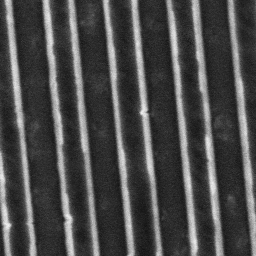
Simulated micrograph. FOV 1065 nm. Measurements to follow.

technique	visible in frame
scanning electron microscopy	one or a few lines or trenches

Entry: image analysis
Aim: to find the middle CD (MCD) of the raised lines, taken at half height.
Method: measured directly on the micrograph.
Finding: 0.114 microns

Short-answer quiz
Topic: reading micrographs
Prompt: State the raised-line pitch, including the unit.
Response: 257 nm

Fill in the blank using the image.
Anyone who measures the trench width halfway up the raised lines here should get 141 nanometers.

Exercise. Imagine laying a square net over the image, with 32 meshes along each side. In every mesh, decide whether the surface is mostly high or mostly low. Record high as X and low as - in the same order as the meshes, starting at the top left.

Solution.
X-----XXX----XXXX----XXX-----XXX
X-----XXX----XXXX----XXXX----XXX
X-----XXX----XXXX----XXXX----XXX
XX----XXX----XXXX----XXXX----XXX
XX----XXX-----XXX-----XXX----XXX
XX----XXXX----XXX-----XXX----XXX
XX----XXXX----XXX-----XXX----XXX
XX----XXXX----XXXX----XXX----XXX
XX----XXXX----XXXX----XXX-----XX
XX----XXXX----XXXX----XXX-----XX
XX-----XXX----XXXX----XXX-----XX
XX-----XXX----XXXX----XXXX----XX
XX-----XXX----XXXX----XXXX----XX
XX-----XXX----XXXX----XXXX----XX
XXX----XXX-----XXX----XXXX----XX
XXX----XXX-----XXX-----XXX----XX
XXX----XXXX----XXXX----XXX----XX
XXX----XXXX----XXXX----XXX----XX
XXX----XXXX----XXXX----XXX-----X
XXX-----XXX----XXXX----XXX-----X
XXX-----XXX----XXXX----XXX-----X
XXX-----XXX----XXXX----XXXX----X
XXX-----XXX----XXXX----XXXX----X
XXX-----XXX----XXXX----XXXX----X
XXX-----XXX-----XXX----XXXX----X
XXXX----XXX-----XXX-----XXX----X
XXXX----XXXX----XXX-----XXX----X
-XXX----XXXX----XXXX----XXX----X
-XXX----XXXX----XXXX----XXX-----
-XXX----XXXX----XXXX----XXX-----
-XXX-----XXX----XXXX----XXX-----
-XXX-----XXX----XXXX----XXXX----